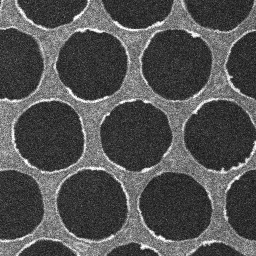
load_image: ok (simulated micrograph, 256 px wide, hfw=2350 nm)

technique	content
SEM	holes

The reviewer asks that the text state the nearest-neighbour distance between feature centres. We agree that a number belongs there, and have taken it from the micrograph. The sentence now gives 748 nm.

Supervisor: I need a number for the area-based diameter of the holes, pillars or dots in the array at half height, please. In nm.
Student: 652